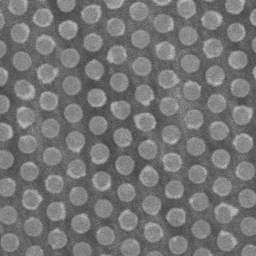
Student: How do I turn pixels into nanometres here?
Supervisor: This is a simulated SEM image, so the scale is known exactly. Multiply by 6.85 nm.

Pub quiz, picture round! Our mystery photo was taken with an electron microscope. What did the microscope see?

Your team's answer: a regular array of raised bodies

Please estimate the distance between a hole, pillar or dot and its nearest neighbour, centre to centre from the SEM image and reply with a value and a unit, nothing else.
186 nm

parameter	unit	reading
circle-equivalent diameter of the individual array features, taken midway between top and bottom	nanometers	126